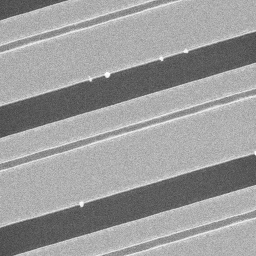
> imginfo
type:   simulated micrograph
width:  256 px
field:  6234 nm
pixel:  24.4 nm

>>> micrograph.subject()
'lines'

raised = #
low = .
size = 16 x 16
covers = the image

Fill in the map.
...#############
################
##############..
###########.....
#######.......##
####.......#####
.......#########
....############
.###############
################
#############...
#########.......
######.......###
##.......#######
......##########
..##############